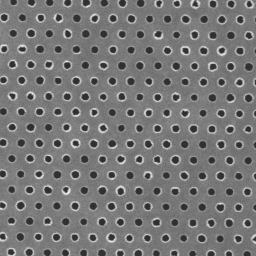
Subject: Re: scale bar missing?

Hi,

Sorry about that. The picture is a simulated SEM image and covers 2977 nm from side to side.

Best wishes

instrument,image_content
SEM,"a regular array of holes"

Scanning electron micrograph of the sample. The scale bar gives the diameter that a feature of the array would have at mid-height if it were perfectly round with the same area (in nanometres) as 81.9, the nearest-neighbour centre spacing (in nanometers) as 205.